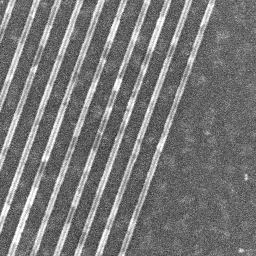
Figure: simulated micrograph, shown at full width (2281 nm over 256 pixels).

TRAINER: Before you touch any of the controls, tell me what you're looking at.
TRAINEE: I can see parallel lines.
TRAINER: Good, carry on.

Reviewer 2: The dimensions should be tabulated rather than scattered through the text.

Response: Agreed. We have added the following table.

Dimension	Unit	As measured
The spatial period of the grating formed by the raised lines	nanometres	185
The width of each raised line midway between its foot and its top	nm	41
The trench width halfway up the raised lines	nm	149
